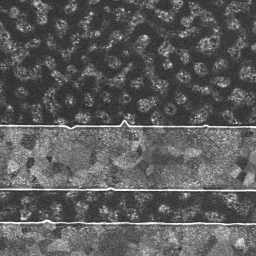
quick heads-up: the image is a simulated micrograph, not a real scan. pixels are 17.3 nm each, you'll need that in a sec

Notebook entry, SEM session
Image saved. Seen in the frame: one or a few lines or trenches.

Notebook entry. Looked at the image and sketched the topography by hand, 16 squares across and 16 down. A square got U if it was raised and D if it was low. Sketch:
DDDDDDDDDDDDDDDD
DDDDDDDDDDDDDDDD
DDDDDDDDDDDDDDDD
DDDDDDDDDDDDDDDD
DDDDDDDDDDDDDDDD
DDDDDDDDDDDDDDDD
DDDDDDDDDDDDDDDD
DDDDDDDDDDDDDDDD
UUUUUUUUUUUUUUUU
UUUUUUUUUUUUUUUU
UUUUUUUUUUUUUUUU
UUUUUUUUUUUUUUUU
DDDDDDDDDDDDDDDD
DDDDDDDDDDDDDDDD
UUUUUUUUUUUUUUUU
UUUUUUUUUUUUUUUU